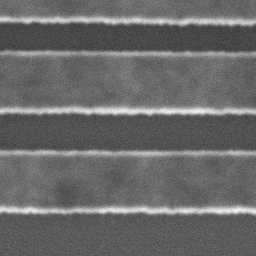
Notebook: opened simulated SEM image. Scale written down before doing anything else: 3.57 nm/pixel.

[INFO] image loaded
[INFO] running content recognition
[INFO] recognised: lines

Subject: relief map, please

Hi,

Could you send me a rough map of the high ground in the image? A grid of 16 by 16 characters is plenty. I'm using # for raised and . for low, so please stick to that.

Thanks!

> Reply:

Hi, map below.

################
..............##
................
################
################
################
################
................
................
#######.......#.
################
################
################
................
................
................